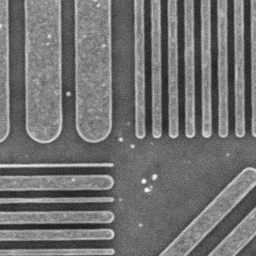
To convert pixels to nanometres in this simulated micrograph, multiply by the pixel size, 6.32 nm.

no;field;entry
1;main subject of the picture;groups of lines, slits or small figures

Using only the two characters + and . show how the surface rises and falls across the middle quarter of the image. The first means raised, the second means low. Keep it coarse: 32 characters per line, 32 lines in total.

...+++++++++......++..++..++..++
...+++++++++......++..++..++..++
...+++++++++......++..++..++..++
...+++++++++......++..++..++...+
...+++++++++......++..++..++...+
...+++++++++......++..++..++...+
...+++++++++......++..++..++...+
...+++++++++......++..++..++...+
...+++++++++......++..++..++...+
...+++++++++......++..++..++...+
...+++++++++......++..++..++...+
...+++++++++......++..++..++...+
...+++++++++......++..++..++...+
...+++++++++......++..++..++...+
...+++++++++......++..++...+...+
...+++++++++......++..++...+...+
...++++++++.......++..++...+...+
....+++++++.......++..++...+...+
.....+++++......................
................................
................................
................................
................................
................................
................................
................................
................................
................................
++++++++++++....................
++++++++++++....................
++++++++++++....................
................................